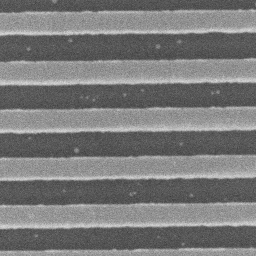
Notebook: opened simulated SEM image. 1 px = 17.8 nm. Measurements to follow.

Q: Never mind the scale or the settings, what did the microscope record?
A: lines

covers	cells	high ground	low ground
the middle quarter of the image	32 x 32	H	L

HHHHHHHHHHHHHHHHHHHHHHHHHHHHHHHH
HHHHHHHHHHHHHHHHHHHHHHHHHHHHHHHH
HHHHHHHHHHHHHHHHHHHHHHHHHHHHHHHH
HHHHHHHHHHHHHHHHHHHHHHHHHHHHHHHH
HHHHHHHHHHHHHLHLLHLLLLLLLLLLLLLL
LLLLLLLLLLLLLLLLLLLLLLLLLLLLLLLL
LLLLLLLLLLLLLLLLLLLLLLLLLLLLLLLL
LLLLLLLLLLLLLLLLLLLLLLLLLLLLLLLL
LLLLLLLLLLLLLLLLLLLLLLLLLLLLLLLL
LLLLLLLLLLLLLLLLLLLLLLLLLLLLLLLL
LLLLLLLLLLLLLLLLLLLLLLLLLLLLLLLL
LLLLLHHHHHHHHHHHHHHHHHHHHHHHHHHH
HHHHHHHHHHHHHHHHHHHHHHHHHHHHHHHH
HHHHHHHHHHHHHHHHHHHHHHHHHHHHHHHH
HHHHHHHHHHHHHHHHHHHHHHHHHHHHHHHH
HHHHHHHHHHHHHHHHHHHHHHHHHHHHHHHH
HHHHHHHHHHHLLLLLLLLLLLLLLLLLLLLL
LLLLLLLLLLLLLLLLLLLLLLLLLLLLLLLL
LLLLLLLLLLLLLLLLLLLLLLLLLLLLLLLL
LLLLLLLLLLLLLLLLLLLLLLLLLLLLLLLL
LLLLLLLLLLLLLLLLLLLLLLLLLLLLLLLL
LLLLLLLLLLLLLLLLLLLLLLLLLLLLLLLL
LLLLLLLLLLLLLLLLLLLLLLLLLLLLLLLL
LHHHHHHHHHHHHHHHHHHHHHHHHHHHHHHH
HHHHHHHHHHHHHHHHHHHHHHHHHHHHHHHH
HHHHHHHHHHHHHHHHHHHHHHHHHHHHHHHH
HHHHHHHHHHHHHHHHHHHHHHHHHHHHHHHH
HHHHHHHHHHHHHHHHHHHHHHHHHHHHHHHH
HHHHHHHHHHHHHHHLHHHLLLLLLLLLLLLL
LLLLLLLLLLLLLLLLLLLLLLLLLLLLLLLL
LLLLLLLLLLLLLLLLLLLLLLLLLLLLLLLL
LLLLLLLLLLLLLLLLLLLLLLLLLLLLLLLL